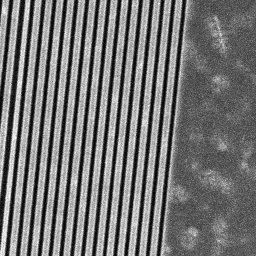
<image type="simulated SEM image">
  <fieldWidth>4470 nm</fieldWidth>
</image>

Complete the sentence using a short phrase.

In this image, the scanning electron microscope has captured parallel lines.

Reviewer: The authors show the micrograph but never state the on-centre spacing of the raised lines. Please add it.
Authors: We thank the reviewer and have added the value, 188 nm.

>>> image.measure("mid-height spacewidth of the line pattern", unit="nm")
82.5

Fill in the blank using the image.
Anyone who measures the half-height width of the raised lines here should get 108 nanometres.